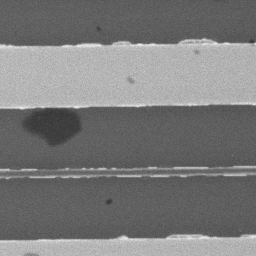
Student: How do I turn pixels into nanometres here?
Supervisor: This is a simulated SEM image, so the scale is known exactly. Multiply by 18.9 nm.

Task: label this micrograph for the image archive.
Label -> lines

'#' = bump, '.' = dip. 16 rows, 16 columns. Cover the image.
................
................
................
################
################
################
#############...
................
................
................
................
................
................
................
................
################